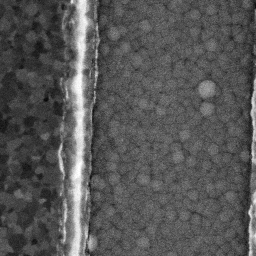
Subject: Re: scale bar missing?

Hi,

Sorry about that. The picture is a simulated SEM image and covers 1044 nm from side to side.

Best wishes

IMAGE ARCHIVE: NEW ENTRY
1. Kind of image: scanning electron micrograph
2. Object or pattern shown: one or a few lines or trenches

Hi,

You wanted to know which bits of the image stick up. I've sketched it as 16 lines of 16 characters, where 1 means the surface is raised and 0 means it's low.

1111100000000000
1111100000000000
1111100000000000
1111100000000000
1111100000000000
1111100000000000
1111100000000000
1111100000000000
1111100000000000
1111100000000000
1111100000000000
1111100000000000
1111100000000000
1111100000000000
1111100000000000
1111100000000000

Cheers